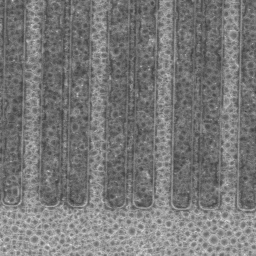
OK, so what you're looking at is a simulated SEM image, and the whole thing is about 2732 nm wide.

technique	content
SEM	parallel lines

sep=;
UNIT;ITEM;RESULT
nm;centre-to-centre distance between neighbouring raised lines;351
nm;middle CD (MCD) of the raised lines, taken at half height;211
